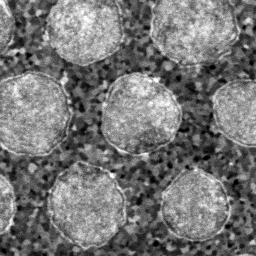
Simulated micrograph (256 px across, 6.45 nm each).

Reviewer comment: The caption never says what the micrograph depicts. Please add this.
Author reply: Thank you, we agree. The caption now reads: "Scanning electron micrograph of holes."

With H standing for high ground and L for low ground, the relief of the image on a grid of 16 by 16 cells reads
LHHLLLLHHHLLLLLH
LHHLLLLLHHLLLLLH
LHHLLLLLHHLLLLLH
HHHHLLLHHHHLLLHH
HHHHHHHHHHHHHHHH
LLLLHHHLLLHHHHLL
LLLLHHHLLLLHHLLL
LLLLHHLLLLLHHHLL
LLLLHHHLLLLHHHLL
HLLHHHHHLHHHHHHH
HHHHLLHHHHHHHHHH
LHHLLLLHHHHLLLHH
LHHLLLLLHHLLLLHH
LHHLLLLLHHLLLLHH
HHHHLLLHHHHLLLHH
HHHHHHHHHHHHHHHH